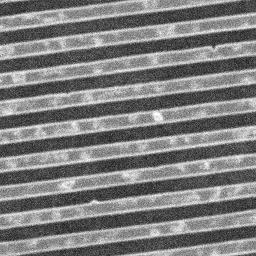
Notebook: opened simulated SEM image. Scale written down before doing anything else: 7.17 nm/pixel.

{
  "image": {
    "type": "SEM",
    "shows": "parallel lines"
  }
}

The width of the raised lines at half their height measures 96 nm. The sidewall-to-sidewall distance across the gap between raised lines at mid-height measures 0.108 µm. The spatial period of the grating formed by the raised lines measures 0.201 um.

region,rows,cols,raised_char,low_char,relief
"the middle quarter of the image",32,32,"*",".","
.***********************........
*****************...............
***********.....................
***.............................
........................********
................****************
.........***********************
.************************.......
*****************...............
*********.......................
*...............................
..........................******
..................**************
.........***********************
.*************************......
******************..............
**********......................
***.............................
........................********
..................**************
.........***********************
.*************************......
********************............
**********......................
***.............................
..........................******
..................**************
..........**********************
...***********************......
******************..............
**********......................
****............................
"